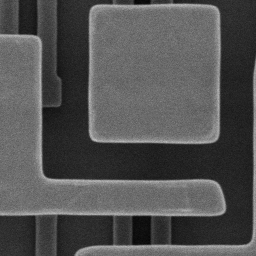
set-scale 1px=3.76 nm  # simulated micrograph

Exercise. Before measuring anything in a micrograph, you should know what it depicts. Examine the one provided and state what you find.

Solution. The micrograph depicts wiring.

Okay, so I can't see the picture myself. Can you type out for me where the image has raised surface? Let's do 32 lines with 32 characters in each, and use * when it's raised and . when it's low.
................................
...........****************.....
...........****************.....
...........****************.....
****.......****************.....
*****......****************.....
*****......****************.....
*****......****************.....
*****......****************.....
*****......****************.....
*****......****************.....
*****......****************.....
*****......****************.....
*****......****************.....
*****......****************.....
*****......****************.....
*****......****************.....
*****.......***************.....
*****...........................
*****...........................
*****...........................
*****...........................
************..........****......
****************************....
****************************....
****************************....
****************************....
................................
................................
................................
...............................*
..........**********************